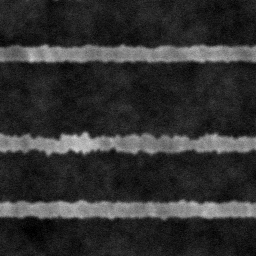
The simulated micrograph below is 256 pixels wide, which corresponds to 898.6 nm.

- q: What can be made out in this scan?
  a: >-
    lines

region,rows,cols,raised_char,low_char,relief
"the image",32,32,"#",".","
................................
................................
................................
................................
................................
................................
################################
############.###################
................................
................................
................................
................................
................................
................................
................................
................................
................................
################################
################################
................................
................................
................................
................................
................................
................................
################################
################################
................................
................................
................................
................................
................................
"